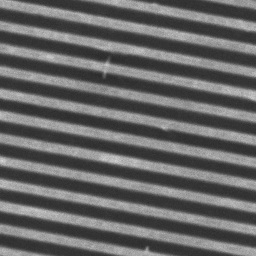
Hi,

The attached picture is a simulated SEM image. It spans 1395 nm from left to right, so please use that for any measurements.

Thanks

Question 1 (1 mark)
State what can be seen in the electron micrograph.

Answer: parallel lines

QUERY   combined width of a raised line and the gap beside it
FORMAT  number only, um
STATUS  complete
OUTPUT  0.121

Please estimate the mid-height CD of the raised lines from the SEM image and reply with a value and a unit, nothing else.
58.2 nanometres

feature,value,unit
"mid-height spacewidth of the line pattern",62.9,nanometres